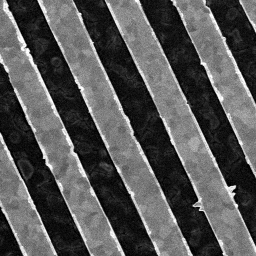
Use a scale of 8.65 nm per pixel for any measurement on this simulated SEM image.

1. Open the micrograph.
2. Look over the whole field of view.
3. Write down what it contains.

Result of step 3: parallel lines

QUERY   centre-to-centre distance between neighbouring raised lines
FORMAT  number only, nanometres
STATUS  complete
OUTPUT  527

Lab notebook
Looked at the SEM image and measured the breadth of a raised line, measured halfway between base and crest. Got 264 nm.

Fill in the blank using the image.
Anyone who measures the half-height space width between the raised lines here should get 264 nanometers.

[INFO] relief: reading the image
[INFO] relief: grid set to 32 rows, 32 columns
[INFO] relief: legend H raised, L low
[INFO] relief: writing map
HLLLLHHHHLLLLHHHHLLLLLHHHHLLLLHH
HLLLLHHHHHLLLLHHHHLLLLHHHHLLLLLH
HHLLLLHHHHLLLLHHHHLLLLLHHHHLLLLH
HHLLLLHHHHHLLLLHHHHLLLLHHHHLLLLL
HHHLLLLHHHHLLLLHHHHLLLLLHHHHLLLL
HHHLLLLHHHHHLLLLHHHHLLLLHHHHLLLL
HHHHLLLLHHHHLLLLHHHHLLLLLHHHHLLL
HHHHLLLLHHHHLLLLLHHHHLLLLHHHHLLL
LHHHHLLLLHHHHLLLLHHHHLLLLLHHHHLL
LHHHHLLLLHHHHLLLLLHHHHLLLLHHHHLL
LLHHHLLLLLHHHHLLLLHHHHLLLLHHHHHL
LLHHHHLLLLHHHHLLLLLHHHHLLLLHHHHL
LLHHHHLLLLLHHHHLLLLHHHHLLLLLHHHH
LLLHHHHLLLLHHHHLLLLLHHHHLLLLHHHH
LLLHHHHLLLLHHHHHLLLLHHHHLLLLHHHH
LLLLHHHHLLLLHHHHLLLLLHHHHLLLLHHH
LLLLHHHHLLLLHHHHHLLLLHHHHLLLLHHH
LLLLLHHHHLLLLHHHHLLLLHHHHHLLLLHH
HLLLLHHHHLLLLHHHHHLLLLHHHHLLLLHH
HLLLLLHHHHLLLLHHHHLLLLHHHHHLLLLH
HHLLLLHHHHLLLLHHHHHLLLLHHHHLLLLH
HHHHLLLHHHLLLLLHHHHLLLLHHHHLLLLL
HHHLLLLHHHHLLLLHHHHHLLLLHHHHLLLL
HHHLLLLHHHHLLLLLHHHHLLLLHHHHHLLL
HHHHLLLLHHHHLLLLHHHHHLLLLHHHHLLL
HHHHLLLLHHHHLLLLLHHHHLLLLHHHHHLL
HHHHHLLLLHHHHLLLLHHHHLLLLHHHHHLL
LHHHHLLLLHHHHLLLLLHHHHLLLLHHHHLL
LHHHHLLLLLHHHHLLLLHHHHLLLLHHHHHL
LLHHHHLLLLHHHHLLLLLHHHHLLLLHHHHL
LLHHHHLLLLLHHHHLLLLHHHHLLLLHHHHH
LLLHHHHLLLLHHHHLLLLLHHHHLLLLHHHH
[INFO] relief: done